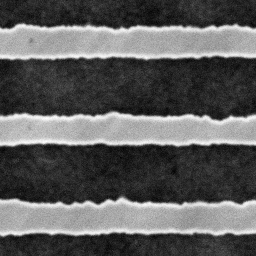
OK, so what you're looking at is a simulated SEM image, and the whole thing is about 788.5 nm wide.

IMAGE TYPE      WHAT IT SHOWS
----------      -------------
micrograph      lines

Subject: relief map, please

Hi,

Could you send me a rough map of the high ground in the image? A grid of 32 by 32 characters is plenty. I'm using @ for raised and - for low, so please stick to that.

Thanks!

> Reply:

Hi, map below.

--------------------------------
--------------------------------
--------------------------------
--@@@@-@@@@@@@---@@@@@@@--@@@@@-
@@@@@@@@@@@@@@@@@@@@@@@@@@@@@@@@
@@@@@@@@@@@@@@@@@@@@@@@@@@@@@@@@
@@@@@@@@@@@@@@@@@@@@@@@@@@@@@@@@
--------------------------------
--------------------------------
--------------------------------
--------------------------------
--------------------------------
--------------------------------
--------------------------------
-@@@@-@--@@@@@@@@@----@@@------@
@@@@@@@@@@@@@@@@@@@@@@@@@@@@@@@@
@@@@@@@@@@@@@@@@@@@@@@@@@@@@@@@@
@@@@@@@@@@@@@@@@@@@@@@@@@@@@@@@@
--------------------------------
--------------------------------
--------------------------------
--------------------------------
--------------------------------
--------------------------------
--------------------------------
@@@@@@@@-@@@-@@@@@@@@@-@@@@@@@@@
@@@@@@@@@@@@@@@@@@@@@@@@@@@@@@@@
@@@@@@@@@@@@@@@@@@@@@@@@@@@@@@@@
@@@@@@@@@@@@@@@@@@@@@@@@@@@@@@@@
--------------------------------
--------------------------------
--------------------------------